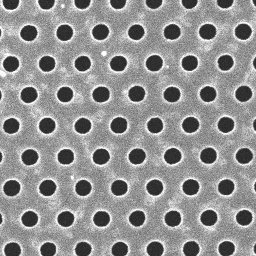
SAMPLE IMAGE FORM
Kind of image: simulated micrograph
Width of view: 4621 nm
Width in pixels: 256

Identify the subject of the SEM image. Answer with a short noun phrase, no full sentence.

a regular array of holes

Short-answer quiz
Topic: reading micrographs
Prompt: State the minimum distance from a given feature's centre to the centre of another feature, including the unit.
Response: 640 nm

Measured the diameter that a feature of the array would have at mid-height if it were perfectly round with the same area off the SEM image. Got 305 nanometers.